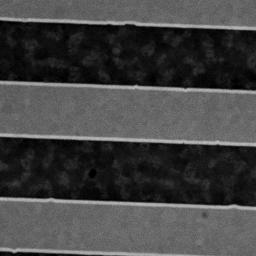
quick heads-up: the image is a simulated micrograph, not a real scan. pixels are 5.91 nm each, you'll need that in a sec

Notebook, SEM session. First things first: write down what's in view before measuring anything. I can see one or a few lines or trenches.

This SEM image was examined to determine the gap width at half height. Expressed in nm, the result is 376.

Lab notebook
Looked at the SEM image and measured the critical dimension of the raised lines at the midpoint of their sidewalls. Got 305 nanometres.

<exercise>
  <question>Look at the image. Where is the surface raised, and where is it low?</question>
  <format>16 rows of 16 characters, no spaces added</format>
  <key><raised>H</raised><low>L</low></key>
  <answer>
HHHHHHHHHHHHHHHH
LLLLLLLLHHHHHHHH
LLLLLLLLLLLLLLLL
LLLLLLLLLLLLLLLL
LLLLLLLLLLLLLLLL
HHHHHHHHHLLLLLLL
HHHHHHHHHHHHHHHH
HHHHHHHHHHHHHHHH
LHHHHHHHHHHHHHHH
LLLLLLLLLLLLLLLL
LLLLLLLLLLLLLLLL
LLLLLLLLLLLLLLLL
HLLLLLLLLLLLLLLL
HHHHHHHHHHHHHHHH
HHHHHHHHHHHHHHHH
HHHHHHHHHHHHHHHH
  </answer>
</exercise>